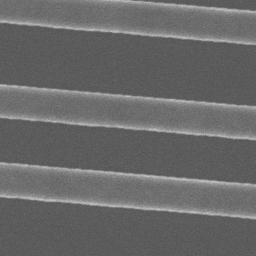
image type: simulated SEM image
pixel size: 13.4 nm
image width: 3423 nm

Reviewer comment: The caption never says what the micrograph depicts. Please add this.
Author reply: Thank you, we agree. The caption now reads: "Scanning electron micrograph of lines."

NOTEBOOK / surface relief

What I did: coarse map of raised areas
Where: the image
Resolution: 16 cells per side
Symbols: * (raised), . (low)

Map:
**************..
.***************
.............***
................
................
***.............
**************..
..**************
.............***
................
****............
****************
..**************
..............**
................
................